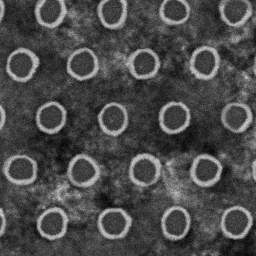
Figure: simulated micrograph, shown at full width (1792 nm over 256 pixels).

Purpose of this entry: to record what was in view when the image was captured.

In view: a regular array of raised bodies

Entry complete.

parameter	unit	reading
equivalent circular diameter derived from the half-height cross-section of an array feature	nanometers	217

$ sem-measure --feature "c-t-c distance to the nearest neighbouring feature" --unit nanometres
422